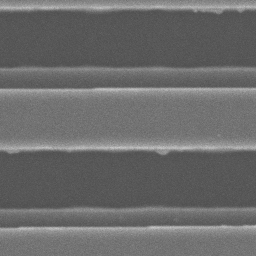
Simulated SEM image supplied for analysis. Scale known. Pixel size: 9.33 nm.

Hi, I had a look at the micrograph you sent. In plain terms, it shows lines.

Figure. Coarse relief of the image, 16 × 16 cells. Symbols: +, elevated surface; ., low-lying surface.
++++.++.....++++
................
................
................
++++++++++++++++
++++++++++++++++
++++++++++++++++
++++++++++++++++
++++++++++++++++
..........+.....
................
................
................
++++++++++++++++
++++++++++++++++
++++++++++++++++